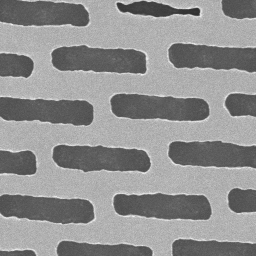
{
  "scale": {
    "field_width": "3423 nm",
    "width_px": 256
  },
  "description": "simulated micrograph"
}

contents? holes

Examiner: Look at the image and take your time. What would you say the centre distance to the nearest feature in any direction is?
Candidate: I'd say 1.03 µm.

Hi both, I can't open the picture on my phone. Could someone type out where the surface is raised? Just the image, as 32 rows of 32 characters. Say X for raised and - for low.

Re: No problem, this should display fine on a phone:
----------XXXXXX----XXXXXXXX----
-----------XXXX----------XXX----
-----------XXXXXXXXXXXXXXXXXXXXX
XXXXXXXXXXXXXXXXXXXXXXXXXXXXXXXX
XXXXXXXXXXXXXXXXXXXXXXXXXXXXXXXX
XXXXXXXXXXXXXXXXXXXXXX--XXXXXXXX
XXXXXXX-----------XXX-----------
----XX------------XXX-----------
----XXX-----------XXXX--X-------
----XXXXXXXXXXXXXXXXXXXXXXXXXXXX
XXXXXXXXXXXXXXXXXXXXXXXXXXXXXXXX
XXXXXXXXXXXXXXXXXXXXXXXXXXXXXXXX
------XX--XXXX-----------XXX----
------------XX------------XX----
------------XXX-----------XXX-X-
XXXXXXXX---XXXXXXXXXXXXXXXXXXXXX
XXXXXXXXXXXXXXXXXXXXXXXXXXXXXXXX
XXXXXXXXXXXXXXXXXXXXXXXXXXXXXXXX
XXXXXXX--------XXXXXX-----------
----XXX------------XX-----------
-----XX------------XXX----------
----XXXXXXXXXXXXXXXXXXXXXXXXXXXX
XXXXXXXXXXXXXXXXXXXXXXXXXXXXXXXX
XXXXXXXXXXXXXXXXXXXXXXXXXXXXXXXX
----XXXXXXXXXX------------XXX---
------------XX------------XXX---
------------XXX-----------XXX---
XXXX--------XXXXXXXXX-XX--XXXXXX
XXXXXXXXXXXXXXXXXXXXXXXXXXXXXXXX
XXXXXXXXXXXXXXXXXXXXXXXXXXXXXXXX
XXXXXXX------XX-XXXXXX----------
----XXX------------XX-----------